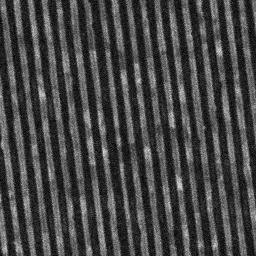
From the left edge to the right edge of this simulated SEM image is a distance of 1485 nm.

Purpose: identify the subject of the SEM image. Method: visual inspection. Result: parallel lines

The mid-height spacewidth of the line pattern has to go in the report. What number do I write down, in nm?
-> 51.8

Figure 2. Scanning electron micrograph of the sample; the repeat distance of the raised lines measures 0.0809 um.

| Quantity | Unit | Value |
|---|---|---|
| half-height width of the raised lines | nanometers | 25.9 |